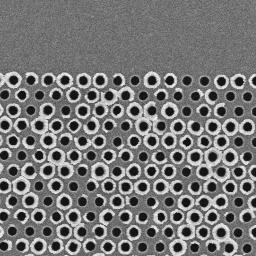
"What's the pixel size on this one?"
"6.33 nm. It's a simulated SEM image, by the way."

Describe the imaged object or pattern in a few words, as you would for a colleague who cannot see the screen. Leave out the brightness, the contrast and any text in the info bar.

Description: a regular array of holes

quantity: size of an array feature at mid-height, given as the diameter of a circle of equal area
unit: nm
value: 55.3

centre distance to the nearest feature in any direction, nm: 107